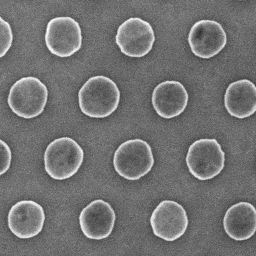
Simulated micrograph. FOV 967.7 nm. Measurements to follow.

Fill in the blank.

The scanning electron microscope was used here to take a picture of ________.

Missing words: a regular array of raised bodies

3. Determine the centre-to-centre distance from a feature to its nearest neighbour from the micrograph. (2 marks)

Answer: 265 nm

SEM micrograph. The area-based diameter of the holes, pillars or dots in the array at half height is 0.143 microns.